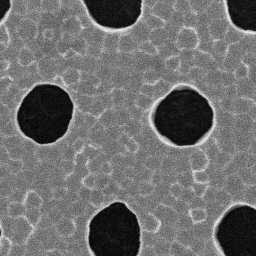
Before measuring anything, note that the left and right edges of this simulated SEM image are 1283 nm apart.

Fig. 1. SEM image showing holes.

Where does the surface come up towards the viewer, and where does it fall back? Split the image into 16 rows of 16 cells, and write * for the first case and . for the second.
.****....*****..
******..*******.
****************
****************
****************
**..*******.****
*...******...***
*...******...***
**..******...***
****************
****************
****************
****************
******..******..
******...*****..
******...*****..